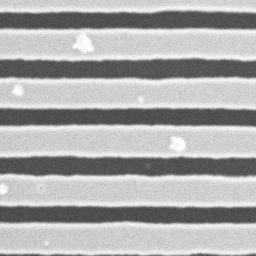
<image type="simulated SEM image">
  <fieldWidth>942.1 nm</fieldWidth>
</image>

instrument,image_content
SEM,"lines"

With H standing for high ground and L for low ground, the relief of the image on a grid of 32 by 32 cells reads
HHHHHHHHHHHHHHHHHHHHHHHHHHHHHHHH
LLHHHLLLLLLHHHLLLHHHLLLLLLLLLLHH
LLLLLLLLLLLLLLLLLLLLLLLLLLLLLLLL
LLLLLLLLLLLLLLLLLLLLLLLLLLLLLLLL
HHHHHHHHHHHHHHHHHHHHHHHHHHHHHHHH
HHHHHHHHHHHHHHHHHHHHHHHHHHHHHHHH
HHHHHHHHHHHHHHHHHHHHHHHHHHHHHHHH
LLLLLLHHHHHHHLLLHLLLLLLLLLLLLHHH
LLLLLLLLLLLLLLLLLLLLLLLLLLLLLLLL
LLLLLLLLLLLLLLLLLLLLLLLLLLLLLLLL
HHHHHHHHHHHHHHHHHHHHHHHHHHHHHHHH
HHHHHHHHHHHHHHHHHHHHHHHHHHHHHHHH
HHHHHHHHHHHHHHHHHHHHHHHHHHHHHHHH
LLHHHHLHHHHLHHLHLLLLLHLLLHLLHHHH
LLLLLLLLLLLLLLLLLLLLLLLLLLLLLLLL
LLLLLLLLLLLLLLLLLLLLLLLLLLLLLLLL
HHHHHHHHHHHHHHHHHHHHHHHHHHHHHHHH
HHHHHHHHHHHHHHHHHHHHHHHHHHHHHHHH
HHHHHHHHHHHHHHHHHHHHHHHHHHHHHHHH
HHHHHHHHLHHHHHHHHHHHHHHHHHHHHHHH
LLLLLLLLLLLLLLLLLLLLLLLLLLLLLLLL
LLLLLLLLLLLLLLLLLLLLLLLLLLLLLLLL
HHHHHHHHHHHHHHHHHHHHHHHHHHHHHHHH
HHHHHHHHHHHHHHHHHHHHHHHHHHHHHHHH
HHHHHHHHHHHHHHHHHHHHHHHHHHHHHHHH
HHHHHHHHHHHHHHHHHHHHHHHHHHHHHHHH
LLLLLLLLLLLLLLLLLLLLLLLLLLLLLLLL
LLLLLLLLLLLLLLLLLLLLLLLLLLLLLLLL
HHHHHHHHHHHHHHHHHHHHHHHHHHHHHHHH
HHHHHHHHHHHHHHHHHHHHHHHHHHHHHHHH
HHHHHHHHHHHHHHHHHHHHHHHHHHHHHHHH
HHHHHHHHHHHHHHHHHHHHHHHHHHHHHHHH